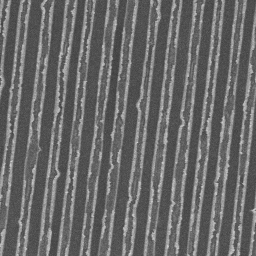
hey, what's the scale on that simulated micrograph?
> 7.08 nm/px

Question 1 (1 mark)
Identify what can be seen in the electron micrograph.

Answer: parallel lines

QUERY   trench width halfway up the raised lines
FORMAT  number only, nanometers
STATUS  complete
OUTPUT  78.3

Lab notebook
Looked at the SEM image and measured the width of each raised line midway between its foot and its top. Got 71.2 nanometers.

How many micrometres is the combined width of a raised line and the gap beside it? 0.151